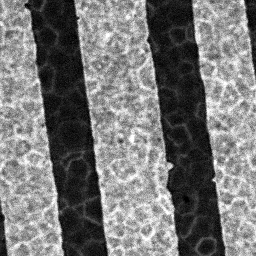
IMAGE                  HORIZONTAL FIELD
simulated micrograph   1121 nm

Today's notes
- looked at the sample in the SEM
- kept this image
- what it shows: one or a few lines or trenches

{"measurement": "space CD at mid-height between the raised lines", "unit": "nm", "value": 205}